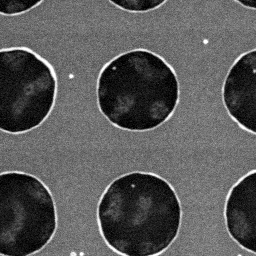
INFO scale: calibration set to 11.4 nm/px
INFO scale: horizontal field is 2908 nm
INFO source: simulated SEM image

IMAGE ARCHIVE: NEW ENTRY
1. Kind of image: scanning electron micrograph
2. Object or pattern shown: holes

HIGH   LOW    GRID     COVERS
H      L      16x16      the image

LLHHHHHHLLHHHHHH
HHHHHHHHHHHHHHHH
HHHHHHHHHHHHHHHH
LLHHHHHHLLHHHHHL
LLLHHHLLLLLHHHLL
LLLHHHLLLLLHHHLL
LLLHHHLLLLLHHHLL
LLLHHHHLLLHHHHHL
HHHHHHHHHHHHHHHH
HHHHHHHHHHHHHHHH
HHHHHHHHHHHHHHHH
LLLHHHHLLLHHHHHL
LLLHHHLLLLLHHHLL
LLLHHHLLLLLHHHLL
LLLHHHLLLLLHHHLL
LLLHHHHLLLHHHHHL